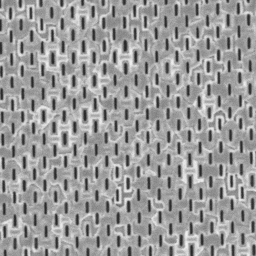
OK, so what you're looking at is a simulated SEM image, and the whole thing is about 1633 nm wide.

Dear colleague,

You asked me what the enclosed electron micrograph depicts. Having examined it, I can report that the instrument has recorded a regular array of holes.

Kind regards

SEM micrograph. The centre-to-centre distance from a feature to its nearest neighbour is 95.5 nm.